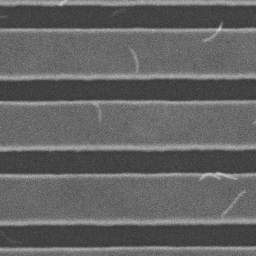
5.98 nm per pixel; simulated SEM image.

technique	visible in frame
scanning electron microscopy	lines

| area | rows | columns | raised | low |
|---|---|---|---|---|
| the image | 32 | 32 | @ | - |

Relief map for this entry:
@@@@@@@@@@@@@@@@@@@@@@@@@@@@@@@@
--------------------------------
--------------------------------
---------------------------@----
@@@@@@@@@@@@@@@@@@@@@@@@@@@@@@@@
@@@@@@@@@@@@@@@@@@@@@@@@@@@@@@@@
@@@@@@@@@@@@@@@@@@@@@@@@@@@@@@@@
@@@@@@@@@@@@@@@@@@@@@@@@@@@@@@@@
@@@@@@@@@@@@@@@@@@@@@@@@@@@@@@@@
@@@@@@@@@@@@@@@@@@@@@@@@@@@@@@@@
--------------------------------
--------------------------------
--------------------------------
@@@@@@@@@@@@@@@@@@@@@@@@@@@@@@@@
@@@@@@@@@@@@@@@@@@@@@@@@@@@@@@@@
@@@@@@@@@@@@@@@@@@@@@@@@@@@@@@@@
@@@@@@@@@@@@@@@@@@@@@@@@@@@@@@@@
@@@@@@@@@@@@@@@@@@@@@@@@@@@@@@@@
@@@@@@@@@@@@@@@@@@@@@@@@@@@@@@@@
--------------------------------
--------------------------------
--------------------------------
@@@@@@@@@@@@@@@@@@@@@@@@@@@@@@@@
@@@@@@@@@@@@@@@@@@@@@@@@@@@@@@@@
@@@@@@@@@@@@@@@@@@@@@@@@@@@@@@@@
@@@@@@@@@@@@@@@@@@@@@@@@@@@@@@@@
@@@@@@@@@@@@@@@@@@@@@@@@@@@@@@@@
@@@@@@@@@@@@@@@@@@@@@@@@@@@@@@@@
--------------------------------
--------------------------------
--------------------------------
@@@@@@@@@@@@@@@@@@@@@@@@@@@@@@@@